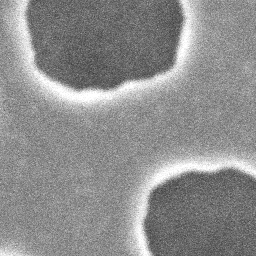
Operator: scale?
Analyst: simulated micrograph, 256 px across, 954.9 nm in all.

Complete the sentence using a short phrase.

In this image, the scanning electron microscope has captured holes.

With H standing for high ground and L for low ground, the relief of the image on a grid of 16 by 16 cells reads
HHLLLLLLLLLHHHHH
HHLLLLLLLLLLHHHH
HHLLLLLLLLLHHHHH
HHLLLLLLLLLHHHHH
HHLLLLLLLLHHHHHH
HHHHLLLHHHHHHHHH
HHHHHHHHHHHHHHHH
HHHHHHHHHHHHHHHH
HHHHHHHHHHHHHHHH
HHHHHHHHHHHHHHHH
HHHHHHHHHHHHHHLH
HHHHHHHHHHLLLLLL
HHHHHHHHHLLLLLLL
HHHHHHHHHLLLLLLL
HHHHHHHHHLLLLLLL
HHHHHHHHHLLLLLLL